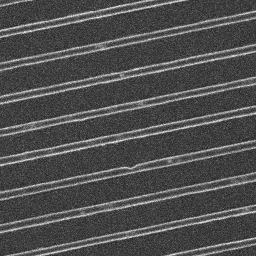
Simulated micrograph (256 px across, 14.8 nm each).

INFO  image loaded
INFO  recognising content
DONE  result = parallel lines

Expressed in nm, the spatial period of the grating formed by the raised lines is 468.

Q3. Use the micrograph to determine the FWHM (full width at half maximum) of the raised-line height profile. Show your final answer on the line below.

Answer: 101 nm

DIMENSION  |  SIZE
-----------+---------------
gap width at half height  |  367 nanometres